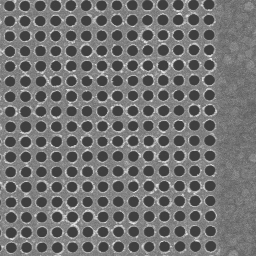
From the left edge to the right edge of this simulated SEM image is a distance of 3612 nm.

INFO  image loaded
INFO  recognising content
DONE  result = a regular array of holes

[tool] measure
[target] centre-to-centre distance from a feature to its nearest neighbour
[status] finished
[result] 14.7 pixels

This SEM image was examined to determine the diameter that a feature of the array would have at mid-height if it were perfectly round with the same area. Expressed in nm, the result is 146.